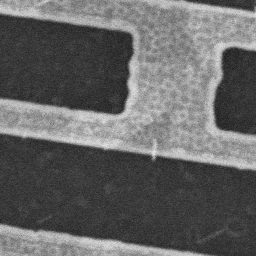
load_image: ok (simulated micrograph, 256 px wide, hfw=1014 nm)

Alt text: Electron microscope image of one or a few lines or trenches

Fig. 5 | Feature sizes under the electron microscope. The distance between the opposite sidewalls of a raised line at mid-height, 30.1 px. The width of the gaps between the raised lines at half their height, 376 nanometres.